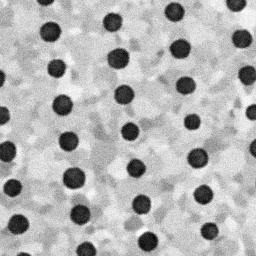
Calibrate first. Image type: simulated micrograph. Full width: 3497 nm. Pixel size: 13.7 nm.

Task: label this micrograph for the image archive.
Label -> a regular array of holes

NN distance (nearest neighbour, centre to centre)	504	nm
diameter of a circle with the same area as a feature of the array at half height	290	nm